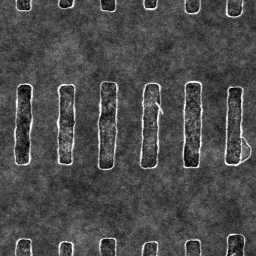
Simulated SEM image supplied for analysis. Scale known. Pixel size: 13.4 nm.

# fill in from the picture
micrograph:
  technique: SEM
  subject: holes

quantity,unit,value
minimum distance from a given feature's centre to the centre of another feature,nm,557